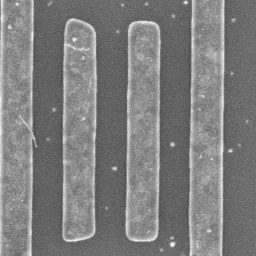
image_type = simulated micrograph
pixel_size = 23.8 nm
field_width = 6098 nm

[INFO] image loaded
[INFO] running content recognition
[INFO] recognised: wiring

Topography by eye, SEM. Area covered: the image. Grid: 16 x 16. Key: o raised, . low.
oo..........oo..
oo..o...oo..oo..
oo..oo..oo..oo..
oo..oo..oo..oo..
oo..oo..oo..oo..
oo..oo..oo..oo..
oo..oo..oo..oo..
oo..oo..oo..oo..
oo..oo..oo..oo..
oo..oo..oo..oo..
oo..oo..oo..oo..
oo..oo..oo..oo..
oo..oo..oo..oo..
oo..oo..oo..oo..
oo..oo..oo..oo..
oo..........oo..